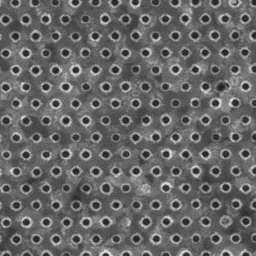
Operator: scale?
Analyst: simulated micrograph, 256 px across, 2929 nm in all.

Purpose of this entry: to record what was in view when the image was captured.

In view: a regular array of holes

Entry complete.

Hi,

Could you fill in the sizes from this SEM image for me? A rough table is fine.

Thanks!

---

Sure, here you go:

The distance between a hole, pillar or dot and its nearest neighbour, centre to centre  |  0.222 µm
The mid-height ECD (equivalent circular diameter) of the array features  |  0.0866 micrometres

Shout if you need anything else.